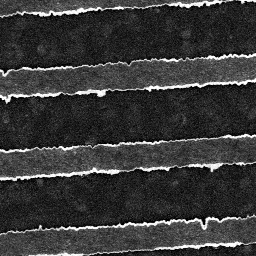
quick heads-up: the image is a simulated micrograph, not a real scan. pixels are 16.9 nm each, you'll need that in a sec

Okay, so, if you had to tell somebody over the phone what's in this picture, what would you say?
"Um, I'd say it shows one or a few lines or trenches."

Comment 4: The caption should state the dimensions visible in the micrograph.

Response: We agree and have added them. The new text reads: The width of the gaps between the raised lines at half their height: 885 nanometers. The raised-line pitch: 1360 nanometers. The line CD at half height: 481 nm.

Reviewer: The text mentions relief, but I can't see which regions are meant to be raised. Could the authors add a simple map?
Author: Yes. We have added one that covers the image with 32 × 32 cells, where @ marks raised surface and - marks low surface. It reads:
@@@@@@@@@@@@@@@@@@@@@@@@@@@-----
@@@@@@@@@@@---------------------
--------------------------------
--------------------------------
-----------------------@--------
-----------------------@--------
--------------------------------
------------------@@@@@@@@@@@@@@
---@--@@@@@@@@@@@@@@@@@@@@@@@@@@
@@@@@@@@@@@@@@@@@@@@@@@@@@@@@@@@
@@@@@@@@@@@@@@@@@@@@@@@@@@@@@@--
@@@@@@@@@@@@@-------------------
@-------------------------------
--------------------------------
-------------------------------@
--------------------------------
--------------------------------
-----------------------@@@@@@@@@
------@@@@@@@@@@@@@@@@@@@@@@@@@@
@@@@@@@@@@@@@@@@@@@@@@@@@@@@@@@@
@@@@@@@@@@@@@@@@@@@@@@@@@@@@-@@-
@@@@@@@@@@@@@@@-----------------
@@------------------------------
--------------------------------
--------------------------------
--------------------------------
--------------------------------
------------------------@-@@@@@@
-------@@@@@@@@@@@@@@@@@@@@@@@@@
@@@@@@@@@@@@@@@@@@@@@@@@@@@@@@@@
@@@@@@@@@@@@@@@@@@@@@@@@@@@@@@@-
@@@@@@@@@@@@@@@-----------------